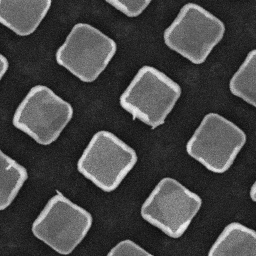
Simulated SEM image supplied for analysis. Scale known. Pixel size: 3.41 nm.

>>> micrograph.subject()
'a regular array of raised bodies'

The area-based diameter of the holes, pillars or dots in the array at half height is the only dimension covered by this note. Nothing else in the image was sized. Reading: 180 nm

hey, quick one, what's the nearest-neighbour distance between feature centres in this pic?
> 264 nanometers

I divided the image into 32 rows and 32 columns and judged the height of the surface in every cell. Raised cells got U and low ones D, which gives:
UUUUUUDDDDDDDDUUUUDDDDDDDDDDDDDD
UUUUUUDDDDDDDDDDUDDDDDDUUUDDDDDD
UUUUUDDDDDDDDDDDDDDDDDUUUUUDDDDD
DUUUDDDDDUUUDDDDDDDDDUUUUUUUDDDD
DDDDDDDDDUUUUDDDDDDDDUUUUUUUDDDD
DDDDDDDDUUUUUUDDDDDDDUUUUUUDDDDD
DDDDDDDUUUUUUUDDDDDDDDUUUUDDDDDD
UDDDDDDUUUUUUUDDDDDDDDDDUDDDDDDU
UDDDDDDDUUUUUDDDDDUDDDDDDDDDDDUU
DDDDDDDDDDUUDDDDDUUUUDDDDDDDDUUU
DDDDDDDDDDDDDDDDUUUUUUDDDDDDDUUU
DDDDUUDDDDDDDDDDUUUUUUDDDDDDDUUU
DDDUUUUUDDDDDDDUUUUUUUDDDDDDDDDU
DDUUUUUUUDDDDDDDUUUUUDDDDDDDDDDD
DDUUUUUUUDDDDDDDDUUUUDDDDDUDDDDD
DDUUUUUUDDDDDDDDDDDDDDDDDUUUUDDD
DDDUUUUDDDDDDDDDDDDDDDDDDUUUUUDD
DDDDDUUDDDDUUUUDDDDDDDDDUUUUUUUD
DDDDDDDDDDDUUUUUDDDDDDDUUUUUUUDD
UDDDDDDDDDUUUUUUUDDDDDDDUUUUUDDD
UUDDDDDDDDUUUUUUUDDDDDDDDUUUUDDD
UUUDDDDDDDUUUUUUDDDDDDDDDDDUDDDD
UUUDDDDDDDDDUUUDDDDDUUDDDDDDDDDD
UUDDDDDDDDDDDUDDDDDDUUUDDDDDDDDD
UUDDDDDUDDDDDDDDDDDUUUUUUDDDDDDD
UDDDDDUUUDDDDDDDDDUUUUUUUDDDDDDD
DDDDDUUUUUUDDDDDDDUUUUUUUDDDDDDD
DDDDDUUUUUUDDDDDDDUUUUUUDDDDDDDD
DDDDUUUUUUUDDDDDDDDDUUUDDDDDUUUD
DDDDDUUUUUDDDDDDDDDDDDDDDDDDUUUU
DDDDDDUUUUDDDDDUUDDDDDDDDDDUUUUU
DDDDDDDUUDDDDDUUUUDDDDDDDDUUUUUU